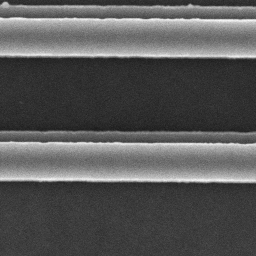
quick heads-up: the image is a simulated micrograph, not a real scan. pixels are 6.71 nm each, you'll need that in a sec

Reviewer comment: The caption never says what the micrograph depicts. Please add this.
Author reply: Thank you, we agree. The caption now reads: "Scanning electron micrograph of lines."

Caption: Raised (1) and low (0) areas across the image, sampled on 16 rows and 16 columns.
0000000000000000
1111111111111111
1111111111111111
0000011111111111
0000000000000000
0000000000000000
0000000000000000
0000000000000000
0000000000000000
1111111111111111
1111111111111111
0000000000000000
0000000000000000
0000000000000000
0000000000000000
0000000000000000